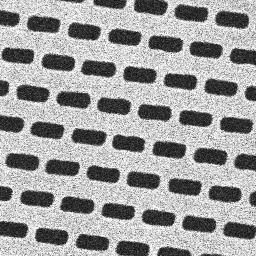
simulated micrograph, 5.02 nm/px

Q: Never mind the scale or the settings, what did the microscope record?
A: a regular array of holes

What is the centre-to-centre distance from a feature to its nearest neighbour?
200 nm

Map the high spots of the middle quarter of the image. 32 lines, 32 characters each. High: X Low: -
---XX--------XXXXXXXXXXXXXXXXXXX
--XX---------XX--------XXXXXXXXX
XXXXX--------XX--------XXX----XX
XXXXXXXXXXXXXXX--------XX-------
XXXXXXXXXXXXXXXXX-----XXX-------
XXXXXXXXXXXXXXXXXXXXXXXXX-------
XXXXXXXXXXXXXXXXXXXXXXXXXXXXXXX-
------XXXXXXXXXXXXXXXXXXXXXXXXXX
-------XXX--XXXXXXXXXXXXXXXXXXXX
-------XX-------XXXXXXXXXXXXXXXX
------XX---------XX----XXXXXXXXX
XXXXXXXXX-------XXX--------XXXXX
XXXXXXXXXXXX----XXX--------XX---
XXXXXXXXXXXXXXXXXXX--------XX---
XXXXXXXXXXXXXXXXXXXXXXXXXXXXX---
XXXXXXXXXXXXXXXXXXXXXXXXXXXXXXX-
XXX----XXXXXXXXXXXXXXXXXXXXXXXXX
XX--------XXXXXXXXXXXXXXXXXXXXXX
XX--------XX-------XXXXXXXXXXXXX
XX--------XX--------XXX---XXXXXX
XXXXXXXXXXXX--------XX--------XX
XXXXXXXXXXXXXX------XX---------X
XXXXXXXXXXXXXXXXXXXXXXX-------XX
XXXXXXXXXXXXXXXXXXXXXXXXXXXX-XXX
---XXXXXXXXXXXXXXXXXXXXXXXXXXXXX
----XXX--XXXXXXXXXXXXXXXXXXXXXXX
----XX--------XXXXXXXXXXXXXXXXXX
---XXX--------XX-------XXXXXXXXX
XXXXXX--------XX--------XXXXXXXX
XXXXXXXXXX---XXX--------XX------
XXXXXXXXXXXXXXXX--------XX------
XXXXXXXXXXXXXXXXXXXXXXXXXX------